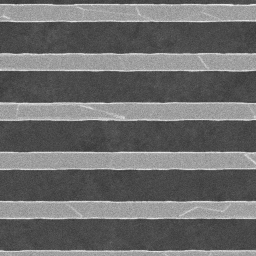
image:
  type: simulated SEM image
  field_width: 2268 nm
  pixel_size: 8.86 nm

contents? wiring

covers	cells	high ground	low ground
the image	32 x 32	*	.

................................
********************************
********************************
................................
................................
................................
................................
********************************
********************************
................................
................................
................................
................................
********************************
********************************
................................
................................
................................
................................
********************************
********************************
................................
................................
................................
................................
********************************
********************************
................................
................................
................................
................................
********************************